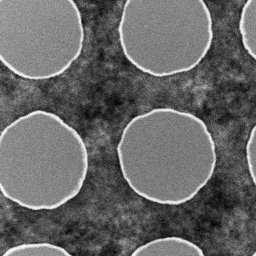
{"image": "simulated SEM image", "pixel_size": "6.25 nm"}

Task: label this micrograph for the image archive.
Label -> raised bodies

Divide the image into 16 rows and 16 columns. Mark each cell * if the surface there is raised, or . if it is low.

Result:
*****...*****..*
*****...*****..*
*****...*****..*
*****...*****...
.***.....**.....
................
................
.***....****....
*****...*****...
*****..******...
*****...*****...
*****...*****...
.***......**....
................
................
.***.....***....